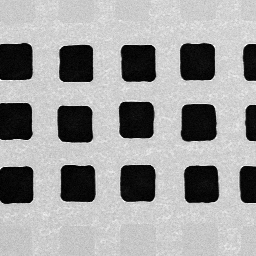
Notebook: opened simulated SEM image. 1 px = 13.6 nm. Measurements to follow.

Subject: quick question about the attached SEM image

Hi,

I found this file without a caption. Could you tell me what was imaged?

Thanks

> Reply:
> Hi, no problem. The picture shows a regular array of holes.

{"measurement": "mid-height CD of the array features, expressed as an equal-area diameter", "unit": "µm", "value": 0.537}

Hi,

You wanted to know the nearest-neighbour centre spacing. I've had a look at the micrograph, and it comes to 0.805 µm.